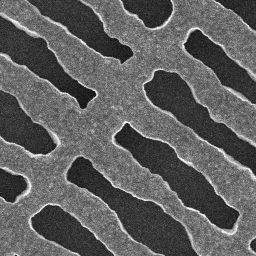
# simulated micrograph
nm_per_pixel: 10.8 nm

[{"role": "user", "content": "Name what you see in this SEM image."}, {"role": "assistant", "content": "holes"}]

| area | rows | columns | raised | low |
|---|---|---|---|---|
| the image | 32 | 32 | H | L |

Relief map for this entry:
HHHHLLLLLLLHHHHLLLLLLLHHHHHLLLLL
HHHHHLLLLLLLHHHHLLLLLLHHHHHHHLLL
LHHHHHLLLLLLLHHHHHLLLHHHHHHHHHLL
LLLHHHHHLLLLLHHHHHHHHHHHHHHHHHHL
LLLLLHHHHLLLLLHHHHHHHHHHLLHHHHHH
LLLLLLHHHHHLLLLHHHHHHHHLLLLHHHHH
LLLLLLLHHHHHLLLLLHHHHHHLLLLLHHHH
HLLLLLLHHHHHHHHLHHHHHHHHHLLLLHHH
HHHLLLLLHHHHHHHHHHHHHHHHHHLLLLHH
HHHHHLLLLHHHHHHHHHHLLLLHHHHLLLLL
HHHHHHLLLLHHHHHHHHLLLLLHHHHHLLLL
LHHHHHHHLLLLHHHHHHLLLLLLHHHHHLLL
LLHHHHHHHHLHHHHHHHHLLLLLLHHHHHHL
LLLHHHHHHHLHHHHHHHHHLLLLLLHHHHHH
LLLLHHHHHHHHHHHHHHHHHHLLLLHHHHHH
LLLLLHHHHHHHHHHHHHHHHHHLLLLLHHHH
LLLLLLHHHHHHHHHLLHHHHHHHLLLLLHHH
HLLLLLLHHHHHHHLLLLLHHHHHHHLLLLLH
HHHLLLLHHHHHHHHLLLLLLLHHHHHLLLLL
HHHHHHHHHHHHHHHHHLLLLLHHHHHHLLLL
HHHHHHHHHLLLHHHHHLLLLLLHHHHHHHLL
LHHHHHHHLLLLHHHHHHHLLLLLLHHHHHHH
LLLHHHHHLLLLLHHHHHHHLLLLLLHHHHHH
LLLLHHHHHHLLLLLHHHHHHLLLLLLHHHHH
LLLHHHHHHHHHLLLLLHHHHHLLLLLHHHHH
HHHHHHHHHHHHHLLLLLLLHHHLLLLLHHHH
HHHHHLLLHHHHHHLLLLLLLHHHHLLLLLHH
HHHHLLLLLLHHHHHLLLLLLLHHHHLLLLHH
HHHHLLLLLLLHHHHLLLLLLLLHHHHLLHHH
HHHHHLLLLLLLHHHHLLLLLLLLHHHHHHHH
HHHHHHHLLLLLLHHHHHLLLLLLHHHHHHHL
HHHHHHHHHLLLLLHHHHHLLLLLHHHHHHHH